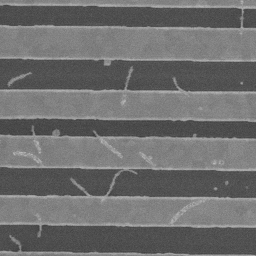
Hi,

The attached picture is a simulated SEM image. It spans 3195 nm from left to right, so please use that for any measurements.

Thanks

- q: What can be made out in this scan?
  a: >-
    lines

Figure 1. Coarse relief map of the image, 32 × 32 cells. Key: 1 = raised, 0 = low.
11111111111111111111111111111111
00000000000000000000000000000000
00000000000000000000000000000000
11111111111111111111110000000010
11111111111111111111111111111111
11111111111111111111111111111111
11111111111111111111111111111111
00000000000000000000000000111111
00000000000000000000000000000000
00000000000000000000000000000000
00000000000000000000000000000000
11111111111111111111111000000000
11111111111111111111111111111111
11111111111111111111111111111111
11111111111111111111111111111111
00000000000000000000000000000000
00000000000000000000000000000000
11111111111111111111111111111111
11111111111111111111111111111111
11111111111111111111111111111111
11111111111111111111111111111111
00000000000000000000000000000000
00000000000000000000000000000000
00000000000000000000000000000000
11111000000101000000000000000000
11111111111111111111111111111111
11111111111111111111111111111111
11111111111111111111111111111111
00000000000000000000000000000000
00000000000000000000000000000000
00000000000000000000000000000000
00100000000000000000000000000000